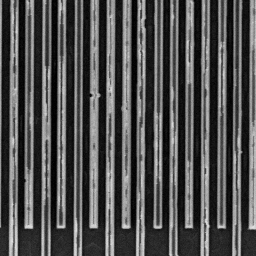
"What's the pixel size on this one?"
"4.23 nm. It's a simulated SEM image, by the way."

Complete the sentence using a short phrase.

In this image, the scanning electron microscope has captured parallel lines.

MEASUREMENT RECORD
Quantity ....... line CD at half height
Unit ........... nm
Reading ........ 27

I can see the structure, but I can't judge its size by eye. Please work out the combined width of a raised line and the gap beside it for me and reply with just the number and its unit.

67.4 nanometers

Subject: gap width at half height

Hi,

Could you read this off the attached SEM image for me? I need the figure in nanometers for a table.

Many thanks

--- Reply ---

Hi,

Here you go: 41.8